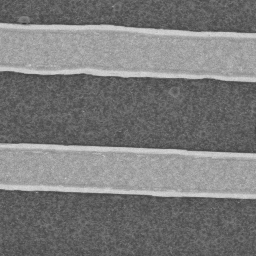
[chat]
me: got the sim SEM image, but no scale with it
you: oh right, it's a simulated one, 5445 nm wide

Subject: one or a few lines or trenches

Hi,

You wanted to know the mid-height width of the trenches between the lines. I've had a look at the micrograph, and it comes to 1.62 microns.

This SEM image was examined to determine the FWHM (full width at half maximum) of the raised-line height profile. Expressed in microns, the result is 0.898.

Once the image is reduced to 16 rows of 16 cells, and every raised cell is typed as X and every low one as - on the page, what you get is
----------------
----------------
XXXXXXXXXXXXXXXX
XXXXXXXXXXXXXXXX
--XX--XXXXXXXXXX
----------------
----------------
----------------
----------------
XXXXXXXXXXX-----
XXXXXXXXXXXXXXXX
XXXXXXXXXXXXXXXX
----------------
----------------
----------------
----------------